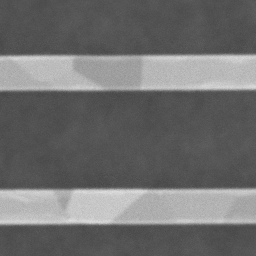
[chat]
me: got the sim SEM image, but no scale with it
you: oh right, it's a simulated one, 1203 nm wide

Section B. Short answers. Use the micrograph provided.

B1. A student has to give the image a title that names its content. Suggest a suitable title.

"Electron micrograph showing wiring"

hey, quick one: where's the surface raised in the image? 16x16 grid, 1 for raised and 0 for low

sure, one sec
0000000000000000
0000000000000000
0000000000000000
0000000000111111
1111111111111111
1111111111111111
0000000000000000
0000000000000000
0000000000000000
0000000000000000
0000000000000000
0000000000000000
1111111111111111
1111111111111111
0000000000000000
0000000000000000